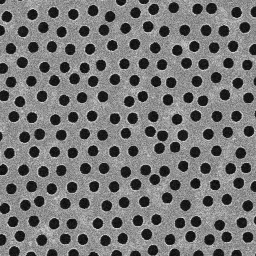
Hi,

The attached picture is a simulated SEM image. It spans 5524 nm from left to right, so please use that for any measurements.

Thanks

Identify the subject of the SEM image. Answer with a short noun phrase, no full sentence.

a regular array of holes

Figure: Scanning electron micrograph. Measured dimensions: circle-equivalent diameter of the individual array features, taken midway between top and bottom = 237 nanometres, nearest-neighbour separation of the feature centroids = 381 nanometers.